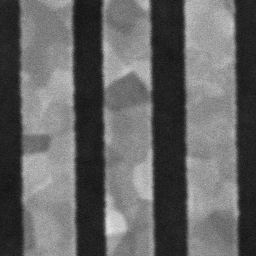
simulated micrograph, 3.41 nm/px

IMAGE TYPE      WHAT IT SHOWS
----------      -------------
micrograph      lines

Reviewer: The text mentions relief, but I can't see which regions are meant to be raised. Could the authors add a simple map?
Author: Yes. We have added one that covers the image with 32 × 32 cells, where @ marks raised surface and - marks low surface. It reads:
---@@@@@@----@@@@@@----@@@@@@---
---@@@@@@----@@@@@@----@@@@@@---
---@@@@@@----@@@@@@----@@@@@@---
---@@@@@@----@@@@@@----@@@@@@---
---@@@@@@----@@@@@@----@@@@@@---
---@@@@@@----@@@@@@----@@@@@@---
---@@@@@@----@@@@@@----@@@@@@---
---@@@@@@----@@@@@@----@@@@@@---
---@@@@@@----@@@@@@----@@@@@@---
---@@@@@@----@@@@@@----@@@@@@---
---@@@@@@----@@@@@@----@@@@@@---
---@@@@@@----@@@@@@----@@@@@@---
---@@@@@@----@@@@@@----@@@@@@---
---@@@@@@----@@@@@@----@@@@@@---
---@@@@@@----@@@@@@----@@@@@@---
---@@@@@@----@@@@@@----@@@@@@---
---@@@@@@----@@@@@@----@@@@@@---
---@@@@@@----@@@@@@----@@@@@@---
---@@@@@@----@@@@@@----@@@@@@---
---@@@@@@----@@@@@@----@@@@@@---
---@@@@@@----@@@@@@----@@@@@@---
---@@@@@@----@@@@@@----@@@@@@---
---@@@@@@----@@@@@@----@@@@@@---
---@@@@@@----@@@@@@----@@@@@@@--
---@@@@@@----@@@@@@----@@@@@@@--
---@@@@@@----@@@@@@----@@@@@@@--
---@@@@@@----@@@@@@----@@@@@@@--
---@@@@@@----@@@@@@-----@@@@@@--
---@@@@@@----@@@@@@-----@@@@@---
---@@@@@@----@@@@@@----@@@@@@@--
---@@@@@@----@@@@@@----@@@@@@@--
---@@@@@@----@@@@@@-----@@@@@@--